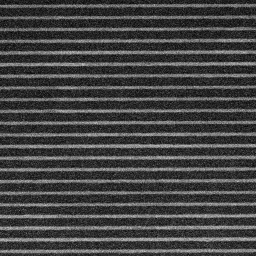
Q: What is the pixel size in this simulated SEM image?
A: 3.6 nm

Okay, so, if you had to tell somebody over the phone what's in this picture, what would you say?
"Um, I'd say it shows parallel lines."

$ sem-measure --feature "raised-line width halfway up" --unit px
2.89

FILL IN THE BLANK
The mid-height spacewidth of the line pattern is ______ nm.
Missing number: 32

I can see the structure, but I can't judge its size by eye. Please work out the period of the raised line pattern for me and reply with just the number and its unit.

42.1 nm